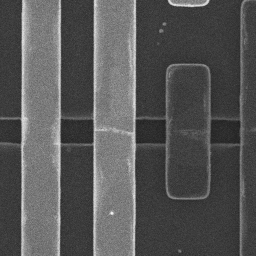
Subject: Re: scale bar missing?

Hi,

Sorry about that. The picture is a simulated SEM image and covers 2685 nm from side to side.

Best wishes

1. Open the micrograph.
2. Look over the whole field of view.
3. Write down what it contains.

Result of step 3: wiring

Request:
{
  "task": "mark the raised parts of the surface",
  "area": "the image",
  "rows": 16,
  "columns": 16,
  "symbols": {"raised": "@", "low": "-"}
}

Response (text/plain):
-@@@--@@-------@
-@@@--@@-------@
-@@@--@@-------@
-@@@--@@-------@
-@@@--@@--@@@--@
-@@@--@@--@@@--@
-@@@--@@--@@@--@
-@@@--@@--@@@--@
-@@@--@@--@@@--@
-@@@--@@--@@@--@
-@@@--@@--@@@--@
-@@@--@@--@@@--@
-@@@--@@-------@
-@@@--@@-------@
-@@@--@@-------@
-@@@--@@-------@